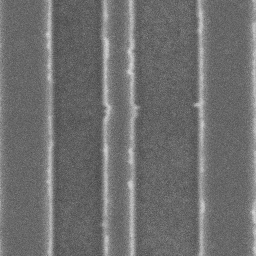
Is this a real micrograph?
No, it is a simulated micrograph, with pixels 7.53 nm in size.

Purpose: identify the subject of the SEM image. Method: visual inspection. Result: one or a few lines or trenches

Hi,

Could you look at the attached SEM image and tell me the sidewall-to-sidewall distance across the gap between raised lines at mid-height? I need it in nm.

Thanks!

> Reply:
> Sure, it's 443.